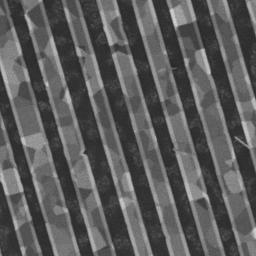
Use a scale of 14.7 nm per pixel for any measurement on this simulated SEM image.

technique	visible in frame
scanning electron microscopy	parallel lines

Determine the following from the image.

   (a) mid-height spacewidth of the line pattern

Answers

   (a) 270 nm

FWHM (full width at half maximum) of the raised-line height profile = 0.234 µm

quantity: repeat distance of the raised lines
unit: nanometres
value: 520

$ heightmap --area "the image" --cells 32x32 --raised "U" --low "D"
UDDUUDDDUUDDUUUDDUUDDUUUDDUUDDDU
UDDUUUDDUUDDDUUDDUUDDUUUDDUUUDDU
UDDUUUDDDUDDDUUDDUUDDDUUDDDUUDDD
UUDDUUDDDUUDDUUDDDUUDDUUUDDUUDDD
UUDDUUDDDUUDDDUUDDUUDDUUUDDUUDDD
UUDDUUUDDDUDDDUUDDUUDDDUUDDDUUDD
UUDDDUUDDDUUDDUUDDUUUDDUUDDDUUDD
UUUDDUUDDDUUDDUUDDDUUDDUUUDDUUDD
UUUDDUUUDDUUDDDUUDDUUDDDUUDDUUUD
DUUDDUUUDDDUDDDUUDDUUDDDUUDDDUUD
DUUUDDUUDDDUUDDUUDDDUUDDUUUDDUUD
DUUUDDUUDDDUUDDDUUDDUUDDUUUDDUUD
DUUUDDUUUDDUUDDDUUDDUUDDDUUDDDUU
DDUUUDDUUDDDUUDDUUDDUUUDDUUDDDUU
DDUUUDDUUDDDUUDDUUUDDUUDDUUUDDUU
DDUUUDDUUUDDUUDDDUUDDUUDDDUUDDUU
UDDUUDDUUUDDDUDDDUUDDUUUDDUUDDDU
UDDUUUDDUUDDDUUDDUUDDDUUDDUUUDDU
UDDUUUDDUUDDDUUDDDUUDDUUDDUUUDDU
UDDUUUDDUUUDDDUDDDUUDDUUDDDUUDDD
UUDDUUUDDUUDDDUUDDUUDDUUUDDUUDDD
UUDDUUUDDUUDDDUUDDUUUDDUUDDUUUDD
UUDDUUUDDUUUDDUUDDDUUDDUUDDUUUDD
DUUDDUUUDUUUDDDUDDDUUDDUUUDDUUDD
DUUDDUUUDDUUDDDUUDDUUDDDUUDDUUUD
DUUDDUUUDDUUDDDUUDDDUUDDUUDDUUUD
DDUDDUUUDDUUUDDUUDDDUUDDUUDDDUUD
DDUUDDUUUDDUUDDDUUDDUUDDDUUDDUUU
DDUUDDUUUDDUUDDDUUDDUUUDDUUDDUUU
DDUUDDUUUDDUUUDDUUDDDUUDDUUDDDUU
DDDUUDDUUDDDUUDDDUDDDUUDDUUUDDUU
DDDUUDDUUUDDUUDDDUUDDUUDDDUUDDUU